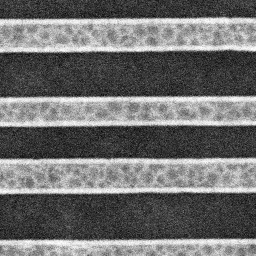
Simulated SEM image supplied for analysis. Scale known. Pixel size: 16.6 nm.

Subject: one or a few lines or trenches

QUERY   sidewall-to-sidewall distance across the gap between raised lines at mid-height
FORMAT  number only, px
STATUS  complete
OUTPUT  50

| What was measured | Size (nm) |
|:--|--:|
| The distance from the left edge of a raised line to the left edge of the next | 1170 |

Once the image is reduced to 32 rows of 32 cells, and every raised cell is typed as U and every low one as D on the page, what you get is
DDDDDDDDDDDDDDDDDDDDDDDDDDDDDDDD
DDDDDDDDDDDDDDDDDDDDDDDDDDDDDDDD
DDDDDDDDDDDDDDDDDDDDDDDDDDDDDDDD
UUUUUUUUUUUUUUUUUUUUUUUUUUUUUUUU
UUUUUUUUUUUUUUUUUUUUUUUUUUUUUUUU
UUUUUUUUUUUUUUUUUUUUUUUUUUUUUUUU
DDDDDDDDDDDDDDDDDDDDDDDDDDDDDDDD
DDDDDDDDDDDDDDDDDDDDDDDDDDDDDDDD
DDDDDDDDDDDDDDDDDDDDDDDDDDDDDDDD
DDDDDDDDDDDDDDDDDDDDDDDDDDDDDDDD
DDDDDDDDDDDDDDDDDDDDDDDDDDDDDDDD
DDDDDDDDDDDDDDDDDDDDDDDDDDDDDDDD
DDDUUUUUUUUUUUUUUUUUUUUUUUUUUUUU
UUUUUUUUUUUUUUUUUUUUUUUUUUUUUUUU
UUUUUUUUUUUUUUUUUUUUUUUUUUUUUUUU
DUUUUUDDDDDDDDDDDDDDDDDDDDDDDDDD
DDDDDDDDDDDDDDDDDDDDDDDDDDDDDDDD
DDDDDDDDDDDDDDDDDDDDDDDDDDDDDDDD
DDDDDDDDDDDDDDDDDDDDDDDDDDDDDDDD
DDDDDDDDDDDDDDDDDDDDDDDDDDDDDDDD
UUUUUUUUUUUUUUUUUUUUUUUUUUUUUUUU
UUUUUUUUUUUUUUUUUUUUUUUUUUUUUUUU
UUUUUUUUUUUUUUUUUUUUUUUUUUUUUUUU
UUUUUUUUUUUUUUUUUUUUUUUUUUUUUUUU
DDDDDDDDDDDDDDDDDDDDDDDDDDDDDDDD
DDDDDDDDDDDDDDDDDDDDDDDDDDDDDDDD
DDDDDDDDDDDDDDDDDDDDDDDDDDDDDDDD
DDDDDDDDDDDDDDDDDDDDDDDDDDDDDDDD
DDDDDDDDDDDDDDDDDDDDDDDDDDDDDDDD
DDDDDDDDDDDDDDDDDDDDDDDDDDDDDDDD
UUUUUUUUUUUUUUUUUUUUUUUUUUUUUUUU
UUUUUUUUUUUUUUUUUUUUUUUUUUUUUUUU